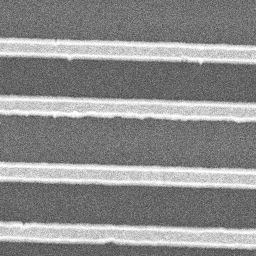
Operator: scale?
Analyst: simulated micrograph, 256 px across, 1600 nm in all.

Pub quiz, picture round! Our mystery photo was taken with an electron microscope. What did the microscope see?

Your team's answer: one or a few lines or trenches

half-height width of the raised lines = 15.7 pixels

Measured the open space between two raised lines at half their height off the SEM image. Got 272 nm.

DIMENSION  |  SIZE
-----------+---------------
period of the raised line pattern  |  384 nanometres